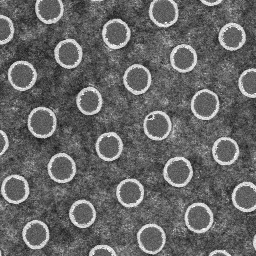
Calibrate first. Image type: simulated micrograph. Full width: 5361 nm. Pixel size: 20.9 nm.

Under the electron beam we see a regular array of raised bodies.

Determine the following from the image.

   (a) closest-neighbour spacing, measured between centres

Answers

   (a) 1060 nm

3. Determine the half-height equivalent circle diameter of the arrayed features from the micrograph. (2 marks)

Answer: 556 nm